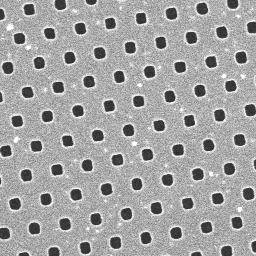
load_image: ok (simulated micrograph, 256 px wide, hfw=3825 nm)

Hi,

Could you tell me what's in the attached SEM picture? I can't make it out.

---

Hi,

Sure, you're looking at a regular array of holes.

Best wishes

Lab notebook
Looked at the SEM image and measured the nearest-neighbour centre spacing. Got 457 nm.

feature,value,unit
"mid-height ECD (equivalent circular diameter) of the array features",182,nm